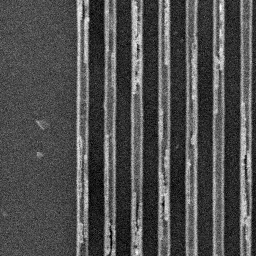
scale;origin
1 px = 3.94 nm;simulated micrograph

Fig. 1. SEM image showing parallel lines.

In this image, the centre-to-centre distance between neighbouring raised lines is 107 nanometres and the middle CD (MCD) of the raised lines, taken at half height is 0.035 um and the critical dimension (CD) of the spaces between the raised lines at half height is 17.8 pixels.